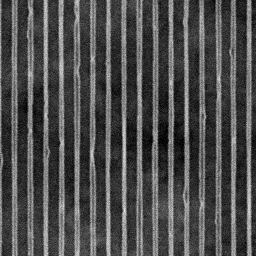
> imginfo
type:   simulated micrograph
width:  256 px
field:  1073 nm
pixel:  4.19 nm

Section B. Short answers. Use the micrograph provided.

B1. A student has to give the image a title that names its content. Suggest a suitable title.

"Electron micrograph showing parallel lines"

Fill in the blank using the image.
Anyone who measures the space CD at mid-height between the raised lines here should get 48.2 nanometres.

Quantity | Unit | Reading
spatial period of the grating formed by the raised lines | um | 0.0655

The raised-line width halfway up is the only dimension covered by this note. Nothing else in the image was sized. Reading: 0.0183 µm